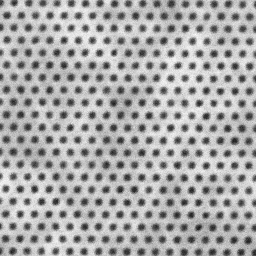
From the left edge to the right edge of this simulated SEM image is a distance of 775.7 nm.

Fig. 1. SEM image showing a regular array of holes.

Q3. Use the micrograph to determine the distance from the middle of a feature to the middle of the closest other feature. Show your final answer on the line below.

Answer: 42.2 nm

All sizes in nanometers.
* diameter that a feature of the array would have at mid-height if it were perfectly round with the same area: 25.1